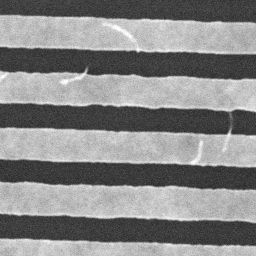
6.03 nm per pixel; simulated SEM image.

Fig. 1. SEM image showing lines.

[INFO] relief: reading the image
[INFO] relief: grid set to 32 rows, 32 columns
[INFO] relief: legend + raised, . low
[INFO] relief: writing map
................................
................................
++++++++++++++++.++.............
++++++++++++++++++++++++++++++++
++++++++++++++++++++++++++++++++
++++++++++++++++++++++++++++++++
........................++++++++
................................
................................
+++++++++++++++.+...............
++++++++++++++++++++++++++++++++
++++++++++++++++++++++++++++++++
++++++++++++++++++++++++++++++++
...................+..++++++++++
................................
................................
++++++++++++++++................
++++++++++++++++++++++++++++++++
++++++++++++++++++++++++++++++++
++++++++++++++++++++++++++++++++
........................++++++++
................................
................................
+++++++++++++++++++++++.........
++++++++++++++++++++++++++++++++
++++++++++++++++++++++++++++++++
++++++++++++++++++++++++++++++++
...........................+++++
................................
................................
++++++++++++++++++++............
++++++++++++++++++++++++++++++++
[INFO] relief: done